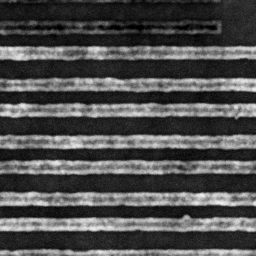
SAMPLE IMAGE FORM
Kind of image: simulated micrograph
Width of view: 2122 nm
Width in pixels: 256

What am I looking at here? parallel lines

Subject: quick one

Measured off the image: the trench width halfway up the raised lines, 182 nm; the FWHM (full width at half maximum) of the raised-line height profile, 71.5 nm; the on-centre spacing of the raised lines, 234 nanometers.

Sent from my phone